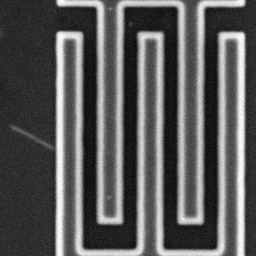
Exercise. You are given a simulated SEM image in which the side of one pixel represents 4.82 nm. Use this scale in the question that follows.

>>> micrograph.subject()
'groups of lines, slits or small figures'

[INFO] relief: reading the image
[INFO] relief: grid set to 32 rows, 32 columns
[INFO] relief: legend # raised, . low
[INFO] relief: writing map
............####......####......
.............##........##.......
.............##........##.......
.............##........##.......
........##...##...##...##...##..
.......###...##...##...##...##..
.......###...##...##...##...##..
.......###...##...##...##...##..
........##...##...##...##...##..
.......###...##...##...##...##..
.......###...##...##...##...##..
.......###...##...##...##...##..
.......###...##...##...##...##..
.......###...##...##...##...##..
.......###...##...##...##...##..
.......###...##..###...##...##..
.......###...##..###...##...##..
.......###...##..###...##...##..
.......###...##..###...##...##..
.......###...##..###...##...##..
.......###..###..###...##...##..
.......###..###..###...##...##..
.......###..###..###...##...##..
.......###...##..###...##...##..
.......###...##..###...##...##..
.......###..###..###...##...##..
.......###..###..###...##...##..
.......###...##..###...##...##..
.......###.......###........##..
.......###.......###........##..
.......###.......###........##..
.......###.......###.......###..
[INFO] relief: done